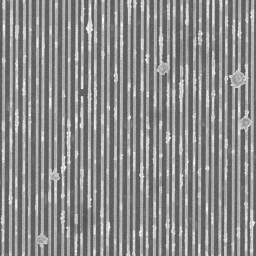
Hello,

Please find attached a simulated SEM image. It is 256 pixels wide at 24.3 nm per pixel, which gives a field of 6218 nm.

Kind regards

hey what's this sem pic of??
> parallel lines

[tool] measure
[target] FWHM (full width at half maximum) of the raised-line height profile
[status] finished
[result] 0.0577 µm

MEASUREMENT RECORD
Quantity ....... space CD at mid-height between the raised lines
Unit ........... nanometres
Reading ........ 94.1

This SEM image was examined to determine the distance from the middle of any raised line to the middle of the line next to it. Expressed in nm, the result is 159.